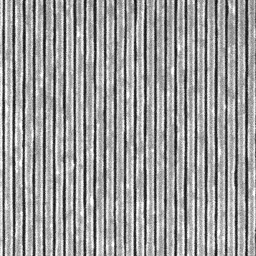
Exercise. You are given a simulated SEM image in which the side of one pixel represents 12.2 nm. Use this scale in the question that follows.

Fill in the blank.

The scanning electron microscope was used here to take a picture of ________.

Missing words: parallel lines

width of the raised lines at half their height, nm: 77.6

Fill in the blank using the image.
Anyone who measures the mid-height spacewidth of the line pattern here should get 3.63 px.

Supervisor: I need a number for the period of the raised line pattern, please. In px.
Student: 10.1